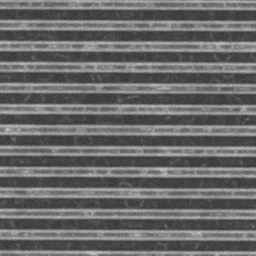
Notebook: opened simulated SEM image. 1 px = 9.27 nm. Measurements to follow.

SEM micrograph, parallel lines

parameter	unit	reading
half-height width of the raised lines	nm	76.5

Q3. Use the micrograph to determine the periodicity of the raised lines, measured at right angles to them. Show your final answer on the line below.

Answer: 21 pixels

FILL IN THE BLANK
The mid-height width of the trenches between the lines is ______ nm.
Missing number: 118